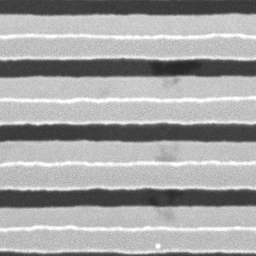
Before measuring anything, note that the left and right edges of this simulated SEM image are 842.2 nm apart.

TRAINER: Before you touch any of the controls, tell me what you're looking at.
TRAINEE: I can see lines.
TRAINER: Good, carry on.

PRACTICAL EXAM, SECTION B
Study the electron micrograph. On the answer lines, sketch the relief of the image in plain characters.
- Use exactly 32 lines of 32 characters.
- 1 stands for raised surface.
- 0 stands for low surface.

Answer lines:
00000000000000000000000000000000
00000000000000000000000000000000
11111111111111111111111111111111
11111111111111111111111111111111
11111111111111111111111111111111
11111111111111111111111111111111
11111111111111111111111111111111
00000000000000000000000000000000
00000000000000000000000000000000
00000000000000000000000000000000
11111111111111111111111111111111
11111111111111111111111111111111
11111111111111111111111111111111
11111111111111111111111111111111
11111111111111111111111111111111
10001000000000000000000000000000
00000000000000000000000000000000
00000000000000000000000000000000
11111111111111111111111111111111
11111111111111111111111111111111
11111111111111111111111111111111
11111111111111111111111111111111
11111111111111111111111111111111
11111111111111111111111111111111
00000000000000000000000000000000
00000000000000000000000000000000
11111111111111111111111111111111
11111111111111111111111111111111
11111111111111111111111111111111
11111111111111111111111111111111
11111111111111111111111111111111
00011111000000111111100111111111